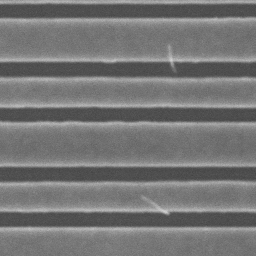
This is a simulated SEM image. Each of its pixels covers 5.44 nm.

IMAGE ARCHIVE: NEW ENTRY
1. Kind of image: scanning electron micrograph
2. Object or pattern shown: lines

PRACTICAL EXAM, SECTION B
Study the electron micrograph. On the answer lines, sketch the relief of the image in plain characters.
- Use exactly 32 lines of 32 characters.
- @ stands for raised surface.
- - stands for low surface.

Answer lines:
--------------------------------
--------------------------------
@@@@@@@@@@@@@@@@@@@@@@@@@@@@@@@@
@@@@@@@@@@@@@@@@@@@@@@@@@@@@@@@@
@@@@@@@@@@@@@@@@@@@@@@@@@@@@@@@@
@@@@@@@@@@@@@@@@@@@@@@@@@@@@@@@@
@@@@@@@@@@@@@@@@@@@@@@@@@@@@@@@@
@@@@@@@@@@@@@@@@@@@@@@@@@@@@@@@@
--------------------------------
--------------------------------
@@@@@@@@@@@@@@@@@@@@@@@@@@@@@@@@
@@@@@@@@@@@@@@@@@@@@@@@@@@@@@@@@
@@@@@@@@@@@@@@@@@@@@@@@@@@@@@@@@
--------------------------------
--------------------------------
@@@@@@@@@@@@@@@@@@@@@@@@@@@@@@@@
@@@@@@@@@@@@@@@@@@@@@@@@@@@@@@@@
@@@@@@@@@@@@@@@@@@@@@@@@@@@@@@@@
@@@@@@@@@@@@@@@@@@@@@@@@@@@@@@@@
@@@@@@@@@@@@@@@@@@@@@@@@@@@@@@@@
@@@@@@@@@@@@@@@@@@@@@@@@@@@@@@@@
--------------------------------
--------------------------------
@@@@@@@@@@@@@@@@@@@@@@@@@@@@@@@@
@@@@@@@@@@@@@@@@@@@@@@@@@@@@@@@@
@@@@@@@@@@@@@@@@@@@@@@@@@@@@@@@@
--------------------@@----------
--------------------------------
--------------------------------
@@@@@@@@@@@@@@@@@@@@@@@@@@@@@@@@
@@@@@@@@@@@@@@@@@@@@@@@@@@@@@@@@
@@@@@@@@@@@@@@@@@@@@@@@@@@@@@@@@